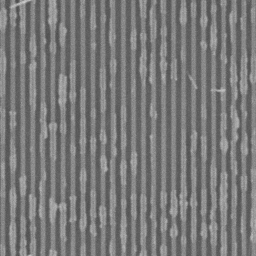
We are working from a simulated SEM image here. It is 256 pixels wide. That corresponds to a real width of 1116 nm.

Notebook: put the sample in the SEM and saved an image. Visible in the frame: parallel lines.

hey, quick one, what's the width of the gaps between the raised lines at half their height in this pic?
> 0.0256 microns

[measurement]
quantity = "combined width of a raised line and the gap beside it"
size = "10 pixels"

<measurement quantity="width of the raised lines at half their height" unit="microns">0.0185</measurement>